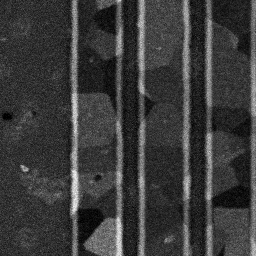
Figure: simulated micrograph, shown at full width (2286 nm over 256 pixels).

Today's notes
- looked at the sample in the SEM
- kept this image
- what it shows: one or a few lines or trenches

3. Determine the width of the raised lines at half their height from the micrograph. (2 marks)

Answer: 402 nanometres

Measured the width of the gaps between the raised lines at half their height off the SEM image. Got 204 nanometers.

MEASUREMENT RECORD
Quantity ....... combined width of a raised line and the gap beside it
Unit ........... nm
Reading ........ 600